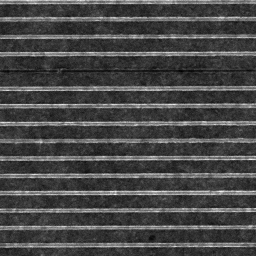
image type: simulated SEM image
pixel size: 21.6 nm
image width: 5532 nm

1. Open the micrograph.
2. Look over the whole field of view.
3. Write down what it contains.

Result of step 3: parallel lines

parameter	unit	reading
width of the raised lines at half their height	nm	67.5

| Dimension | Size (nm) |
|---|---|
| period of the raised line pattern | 375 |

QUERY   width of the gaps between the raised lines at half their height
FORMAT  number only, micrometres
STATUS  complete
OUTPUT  0.305